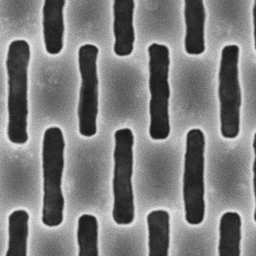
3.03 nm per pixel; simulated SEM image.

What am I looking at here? holes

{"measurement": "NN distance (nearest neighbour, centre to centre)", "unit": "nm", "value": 213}